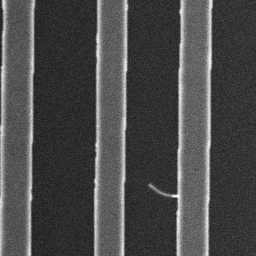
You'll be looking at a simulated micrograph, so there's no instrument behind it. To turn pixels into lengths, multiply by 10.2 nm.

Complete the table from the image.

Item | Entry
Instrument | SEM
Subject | lines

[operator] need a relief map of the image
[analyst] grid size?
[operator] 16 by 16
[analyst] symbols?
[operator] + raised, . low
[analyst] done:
++....++...++...
++....++...++...
++....++...++...
++....++...++...
++....++...++...
++....++...++...
++....++...++...
++....++...++...
++....++...++...
++....++...++...
++....++...++...
++....++...++...
++....++...++...
++....++...++...
++....++...++...
++....++...++...